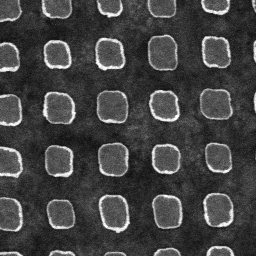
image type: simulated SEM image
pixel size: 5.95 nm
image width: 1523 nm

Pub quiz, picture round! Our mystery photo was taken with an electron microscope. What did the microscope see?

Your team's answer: a regular array of raised bodies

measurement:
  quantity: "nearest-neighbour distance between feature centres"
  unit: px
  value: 52.4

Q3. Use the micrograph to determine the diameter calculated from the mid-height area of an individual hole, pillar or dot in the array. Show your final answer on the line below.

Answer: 0.191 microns